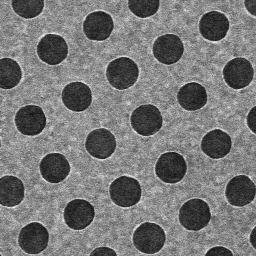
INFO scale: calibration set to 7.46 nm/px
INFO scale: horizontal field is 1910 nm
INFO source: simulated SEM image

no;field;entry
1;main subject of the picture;a regular array of holes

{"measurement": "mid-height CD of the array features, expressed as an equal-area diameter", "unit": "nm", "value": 233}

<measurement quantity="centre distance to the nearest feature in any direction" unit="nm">382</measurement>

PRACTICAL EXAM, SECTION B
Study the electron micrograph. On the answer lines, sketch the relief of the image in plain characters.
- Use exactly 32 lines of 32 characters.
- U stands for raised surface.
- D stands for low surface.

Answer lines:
UDDDDUUUUUUUUUUUDDDDUUUUUUUUUUUD
UUDDDUUUUUUUDUUUDDDUUUUUUUDUUUUD
UUUUUUUUUUUDDDUUUUUUUUUUUDDDUUUU
UUUUUUUUUUDDDDUUUUUUUUUUUDDDDUUU
UUUUUDDDUUUDDDUUUUUUDDUUUDDDUUUU
UUUUUDDDUUUUUUUUUUUDDDDUUUUUUUUU
UUUUUDDDUUUUUUUUUUUDDDDUUUUUUUUU
DDUUUDDDUUUUUUDDUUUUDDUUUUUUUDDU
DDDUUUUUUUUUUDDDDUUUUUUUUUUUDDDD
DDDUUUUUUUUUUDDDDUUUUUUUUUUUDDDD
DDUUUUUUUDDUUUDDDUUUUUUDDUUUDDDU
UUUUUUUUDDDUUUUUUUUUUUDDDDUUUUUU
UUUUUUUUDDDDUUUUUUUUUUDDDDUUUUUU
UUUDDUUUDDDUUUUUUDDDUUUDDUUUUUUU
UUDDDDUUUUUUUUUUDDDDUUUUUUUUUUUD
UUDDDDUUUUUUUUUUDDDDUUUUUUUUUUUD
UUUDDUUUUUUDDDUUUDDDUUUUUUDDUUUU
UUUUUUUUUUUDDDUUUUUUUUUUUDDDDUUU
UUUUUUUUUUUDDDUUUUUUUUUUUDDDDUUU
UUUUUUDDUUUUDDUUUUUUDDDUUUDDUUUU
UUUUUDDDDUUUUUUUUUUDDDDUUUUUUUUU
UUUUUDDDDUUUUUUUUUUDDDDUUUUUUUUU
DDUUUUDDUUUUUUDDDUUUDDDUUUUUUDDU
DDDUUUUUUUUUUUDDDDUUUUUUUUUUDDDD
DDDUUUUUUUUUUUDDDDUUUUUUUUUUDDDD
DDUUUUUUDDDUUUDDDUUUUUUDDDUUUDDU
UUUUUUUUDDDDUUUUUUUUUUDDDDUUUUUU
UUUUUUUUDDDDUUUUUUUUUUDDDDUUUUUU
UUUDDDUUUDDUUUUUUDDDUUUDDUUUUUUU
UUDDDDUUUUUUUUUUUDDDDUUUUUUUUUUD
UUDDDDUUUUUUUUUUUDDDUUUUUUUUUUUD
UUUDDUUUUUUDDDUUUUDDUUUUUUDDDUUU